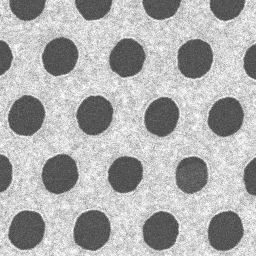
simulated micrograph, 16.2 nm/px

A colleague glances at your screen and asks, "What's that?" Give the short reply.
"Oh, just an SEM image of a regular array of holes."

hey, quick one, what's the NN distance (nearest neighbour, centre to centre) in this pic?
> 1050 nm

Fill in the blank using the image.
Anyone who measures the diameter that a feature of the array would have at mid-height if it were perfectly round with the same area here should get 623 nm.